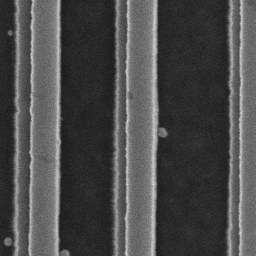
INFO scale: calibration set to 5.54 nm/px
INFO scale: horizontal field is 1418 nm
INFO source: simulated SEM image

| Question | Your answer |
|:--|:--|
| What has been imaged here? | lines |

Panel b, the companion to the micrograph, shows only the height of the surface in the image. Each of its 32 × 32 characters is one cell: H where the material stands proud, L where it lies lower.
LLHHHHHLLLLLLLLHHHHHLLLLLLLLLHHH
LLHHHHHLLLLLLLLHHHHHLLLLLLLLLHHH
LLHHHHHLLLLLLLLHHHHHLLLLLLLLLHHH
LLHHHHHLLLLLLLLHHHHLLLLLLLLLLHHH
LLHHHHHLLLLLLLLHHHHHLLLLLLLLLHHH
LLHHHHHLLLLLLLLHHHHLLLLLLLLLLHHH
LLHHHHHLLLLLLLLHHHHHLLLLLLLLLHHH
LLHHHHHLLLLLLLLHHHHLLLLLLLLLLHHH
LLHHHHHLLLLLLLLHHHHLLLLLLLLLLHHH
LLHHHHHLLLLLLLLHHHHHLLLLLLLLLHHH
LLHHHHHLLLLLLLLHHHHLLLLLLLLLLHHH
LLHHHHHLLLLLLLLHHHHLLLLLLLLLLHHH
LLHHHHHLLLLLLLLHHHHLLLLLLLLLLHHH
LLHHHHHLLLLLLLLHHHHHLLLLLLLLLHHH
LLHHHHHLLLLLLLLHHHHLLLLLLLLLLHHH
LLHHHHHLLLLLLLLHHHHLLLLLLLLLLHHH
LLHHHHHLLLLLLLLHHHHLLLLLLLLLLHHH
LLHHHHHHLLLLLLLHHHHLLLLLLLLLLHHH
LLHHHHHLLLLLLLLHHHHLLLLLLLLLLHHH
LLHHHHHLLLLLLLLHHHHLLLLLLLLLLHHH
LLHHHHHLLLLLLLLHHHHLLLLLLLLLLHHH
LLHHHHHLLLLLLLLHHHHLLLLLLLLLLHHH
LLHHHHHLLLLLLLLHHHHLLLLLLLLLLHHH
LLHHHHHLLLLLLLLHHHHLLLLLLLLLLHHH
LLHHHHHLLLLLLLLHHHHLLLLLLLLLLHHH
LLHHHHHLLLLLLLLHHHHLLLLLLLLLLHHH
LLHHHHHLLLLLLLLHHHHLLLLLLLLLLHHH
LLHHHHHLLLLLLLLHHHHLLLLLLLLLLHHH
LLHHHHHLLLLLLLLHHHHLLLLLLLLLLHHH
LLHHHHHLLLLLLLLHHHHLLLLLLLLLLHHH
LLHHHHHLLLLLLLLHHHHLLLLLLLLLLHHH
LLHHHHHLLLLLLLLHHHHLLLLLLLLLLHHH